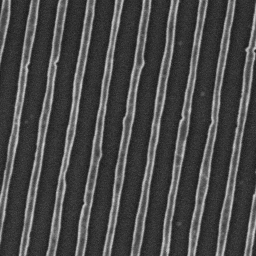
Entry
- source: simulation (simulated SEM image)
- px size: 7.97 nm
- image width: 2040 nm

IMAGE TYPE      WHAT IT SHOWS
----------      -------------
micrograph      parallel lines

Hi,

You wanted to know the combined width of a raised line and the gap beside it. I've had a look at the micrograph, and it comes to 221 nm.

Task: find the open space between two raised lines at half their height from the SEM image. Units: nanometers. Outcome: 169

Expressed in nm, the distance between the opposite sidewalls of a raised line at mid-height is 56.1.